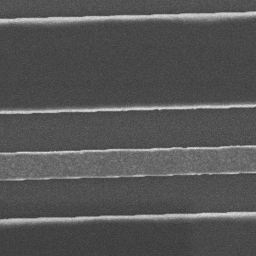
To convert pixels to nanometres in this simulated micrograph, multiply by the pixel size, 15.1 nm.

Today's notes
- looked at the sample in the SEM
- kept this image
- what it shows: lines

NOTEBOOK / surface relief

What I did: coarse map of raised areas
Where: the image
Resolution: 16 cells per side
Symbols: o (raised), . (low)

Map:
................
oooooooooooooooo
oooooooooooooooo
oooooooooooooooo
oooooooooooooooo
oooooooooooooooo
oooooooooooooooo
................
................
....oooooooooooo
oooooooooooooooo
................
................
..........oooooo
oooooooooooooooo
oooooooooooooooo